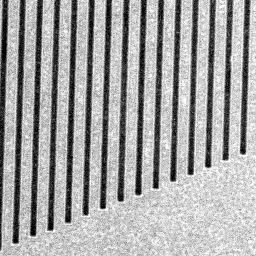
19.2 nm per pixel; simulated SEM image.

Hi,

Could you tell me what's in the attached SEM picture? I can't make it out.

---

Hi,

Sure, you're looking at parallel lines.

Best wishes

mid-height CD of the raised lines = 0.206 µm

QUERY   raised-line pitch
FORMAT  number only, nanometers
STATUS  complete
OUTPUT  332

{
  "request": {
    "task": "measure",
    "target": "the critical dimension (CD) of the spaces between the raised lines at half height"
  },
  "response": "120 nm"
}